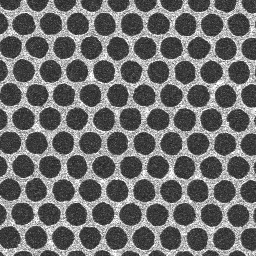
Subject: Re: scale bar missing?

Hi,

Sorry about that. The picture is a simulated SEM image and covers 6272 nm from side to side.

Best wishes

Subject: a regular array of holes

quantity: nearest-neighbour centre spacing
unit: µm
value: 0.652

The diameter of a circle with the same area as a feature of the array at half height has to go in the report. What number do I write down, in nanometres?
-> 560